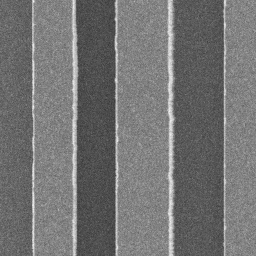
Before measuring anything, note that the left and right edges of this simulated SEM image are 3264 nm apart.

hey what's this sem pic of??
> lines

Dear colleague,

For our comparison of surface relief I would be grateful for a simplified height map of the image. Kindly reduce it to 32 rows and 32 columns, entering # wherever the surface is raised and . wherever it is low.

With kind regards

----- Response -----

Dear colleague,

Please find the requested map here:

....#####......######.......####
....#####......######.......####
....#####......######.......####
....#####......######.......####
....#####......######.......####
....#####......######.......####
....#####......######.......####
....#####......######.......####
....#####......######.......####
....#####......######.......####
....#####......######.......####
....#####......######.......####
....#####......######.......####
....#####......######.......####
....#####......######.......####
....#####......######.......####
....#####......######.......####
....#####......######.......####
....#####......######.......####
....#####......######.......####
....#####......######.......####
....#####......######.......####
....#####......######.......####
....#####......######.......####
....#####......######.......####
....#####......######.......####
....#####......######.......####
....#####......######.......####
....#####......######.......####
....#####......######.......####
....#####......######.......####
....#####......######.......####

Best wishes